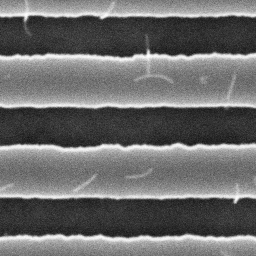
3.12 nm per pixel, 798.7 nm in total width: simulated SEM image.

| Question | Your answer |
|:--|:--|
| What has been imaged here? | lines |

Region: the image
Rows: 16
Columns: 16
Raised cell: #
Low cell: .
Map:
################
................
................
.#####...#######
################
################
################
................
................
################
################
################
................
................
................
################